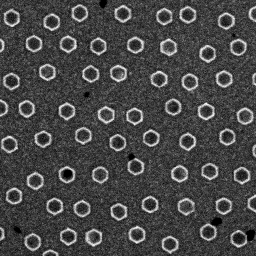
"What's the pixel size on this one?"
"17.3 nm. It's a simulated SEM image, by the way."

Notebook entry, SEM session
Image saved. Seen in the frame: a regular array of raised bodies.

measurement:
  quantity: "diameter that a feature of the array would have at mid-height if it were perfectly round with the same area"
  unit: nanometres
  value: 277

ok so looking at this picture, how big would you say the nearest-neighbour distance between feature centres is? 523 nanometers